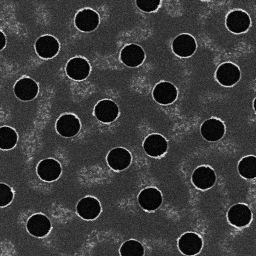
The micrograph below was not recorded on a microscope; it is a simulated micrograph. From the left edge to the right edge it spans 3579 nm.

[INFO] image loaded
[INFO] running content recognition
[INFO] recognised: a regular array of holes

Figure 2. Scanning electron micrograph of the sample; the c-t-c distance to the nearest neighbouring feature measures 676 nm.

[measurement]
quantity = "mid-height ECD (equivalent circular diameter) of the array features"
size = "328 nanometers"